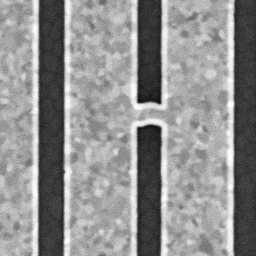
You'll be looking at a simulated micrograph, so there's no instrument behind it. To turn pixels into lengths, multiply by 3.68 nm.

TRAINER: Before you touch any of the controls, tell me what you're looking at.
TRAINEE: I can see one or a few lines or trenches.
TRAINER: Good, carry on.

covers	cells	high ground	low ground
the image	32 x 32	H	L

HHHHLLLLLHHHHHHHHLLLLHHHHHHHHLLL
HHHHLLLLHHHHHHHHHLLLLHHHHHHHHLLL
HHHHLLLLHHHHHHHHHLLLLHHHHHHHHLLL
HHHHLLLLHHHHHHHHHLLLLHHHHHHHHLLL
HHHHHLLLLHHHHHHHHLLLLHHHHHHHHLLL
HHHHLLLLHHHHHHHHHLLLLHHHHHHHHLLL
HHHHLLLLHHHHHHHHHLLLLHHHHHHHHLLL
HHHHLLLLHHHHHHHHHLLLLHHHHHHHHLLL
HHHHLLLLHHHHHHHHHLLLLHHHHHHHHLLL
HHHHLLLLHHHHHHHHHLLLLHHHHHHHHLLL
HHHHLLLLHHHHHHHHHLLLLHHHHHHHHLLL
HHHHLLLLHHHHHHHHHLLLLHHHHHHHHLLL
HHHHLLLLHHHHHHHHHLLLLHHHHHHHHLLL
HHHHLLLLHHHHHHHHHHHHHHHHHHHHHLLL
HHHHLLLLHHHHHHHHHHHHHHHHHHHHHLLL
HHHHLLLLHHHHHHHHHLLLHHHHHHHHHLLL
HHHHLLLLHHHHHHHHHLLLLHHHHHHHHLLL
HHHHLLLLHHHHHHHHHLLLLHHHHHHHHLLL
HHHHLLLLHHHHHHHHHLLLLHHHHHHHHLLL
HHHHLLLLHHHHHHHHHLLLLHHHHHHHHLLL
HHHHLLLLHHHHHHHHHLLLLHHHHHHHHLLL
HHHHLLLLHHHHHHHHHLLLLHHHHHHHHLLL
HHHHLLLLHHHHHHHHHLLLLHHHHHHHHLLL
HHHHLLLLHHHHHHHHHLLLLHHHHHHHHLLL
HHHHLLLLHHHHHHHHHLLLLHHHHHHHHLLL
HHHHLLLLHHHHHHHHHLLLLHHHHHHHHLLL
HHHHLLLLHHHHHHHHHLLLLHHHHHHHHLLL
HHHHLLLLHHHHHHHHHLLLLHHHHHHHHLLL
HHHHLLLLHHHHHHHHHLLLLHHHHHHHHLLL
HHHHLLLLHHHHHHHHHLLLLHHHHHHHHLLL
HHHHLLLLHHHHHHHHHLLLLHHHHHHHHLLL
HHHHLLLLHHHHHHHHHLLLHHHHHHHHHLLL